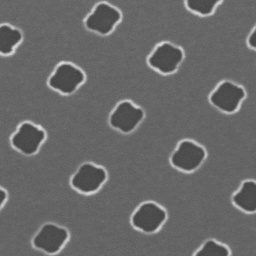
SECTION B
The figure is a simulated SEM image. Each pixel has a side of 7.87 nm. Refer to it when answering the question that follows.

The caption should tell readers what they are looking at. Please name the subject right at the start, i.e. a regular array of holes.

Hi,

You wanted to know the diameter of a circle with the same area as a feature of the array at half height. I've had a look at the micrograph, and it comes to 228 nm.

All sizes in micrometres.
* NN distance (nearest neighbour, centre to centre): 0.561